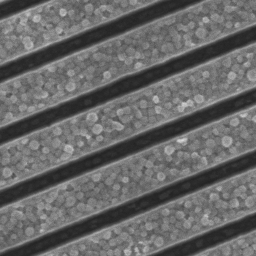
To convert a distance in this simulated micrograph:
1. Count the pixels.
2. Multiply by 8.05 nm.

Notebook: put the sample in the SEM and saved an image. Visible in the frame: parallel lines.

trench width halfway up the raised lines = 118 nanometres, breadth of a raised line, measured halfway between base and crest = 346 nm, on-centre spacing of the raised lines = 466 nm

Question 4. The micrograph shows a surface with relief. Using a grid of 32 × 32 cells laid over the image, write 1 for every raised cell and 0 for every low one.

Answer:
00000111111111111110000011111111
00111111111111111000001111111111
11111111111111000001111111111111
11111111111100000111111111111110
11111111100000011111111111111000
11111110000011111111111111000001
11110000011111111111111100000111
11000001111111111111100000111111
00000111111111111110000011111111
00111111111111110000011111111111
11111111111111000001111111111111
11111111111100001111111111111110
11111111100000111111111111110000
11111100000011111111111111000001
11110000011111111111111000001111
10000001111111111111100000111111
00001111111111111100000111111111
01111111111111110000011111111111
11111111111110000011111111111111
11111111111000001111111111111100
11111111000001111111111111110000
11111100000111111111111110000011
11100000111111111111111000001111
10000011111111111111000001111111
00001111111111111100000111111111
01111111111111100000111111111111
11111111111110000011111111111111
11111111110000001111111111111100
11111111000001111111111111100000
11111000001111111111111110000011
11100000111111111111110000011111
00000011111111111111000001111111